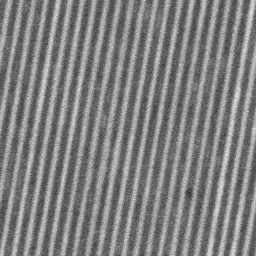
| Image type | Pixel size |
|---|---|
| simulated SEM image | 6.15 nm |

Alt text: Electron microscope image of parallel lines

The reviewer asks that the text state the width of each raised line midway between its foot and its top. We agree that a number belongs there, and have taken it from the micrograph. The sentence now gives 22.8 nanometers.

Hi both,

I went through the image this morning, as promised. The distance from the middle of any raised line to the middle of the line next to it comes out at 0.0739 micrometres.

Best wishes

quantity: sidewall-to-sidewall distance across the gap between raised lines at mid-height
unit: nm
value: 50.7